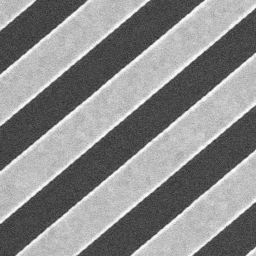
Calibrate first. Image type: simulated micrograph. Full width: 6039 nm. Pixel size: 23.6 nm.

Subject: lines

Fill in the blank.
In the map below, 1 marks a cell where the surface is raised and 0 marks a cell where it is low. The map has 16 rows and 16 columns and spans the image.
1100011110001111
0000111100011110
0001110000111100
0111100001110000
1111000111100001
1110001111000111
1100011110001111
0000111100011110
0001110000111100
0011100001110000
1111000111100001
1110001111000011
1100011110001111
1000111100011110
0001110000111100
0011100001111000